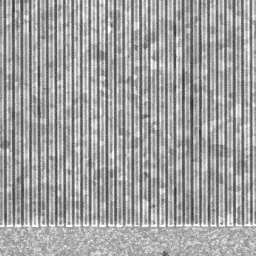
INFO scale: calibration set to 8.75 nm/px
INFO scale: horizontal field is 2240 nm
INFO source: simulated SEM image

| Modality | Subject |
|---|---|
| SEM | parallel lines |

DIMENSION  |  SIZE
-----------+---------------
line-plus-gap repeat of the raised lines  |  74.2 nm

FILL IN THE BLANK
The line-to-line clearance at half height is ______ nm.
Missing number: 32.8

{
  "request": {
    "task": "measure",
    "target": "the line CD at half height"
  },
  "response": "41.6 nanometers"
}